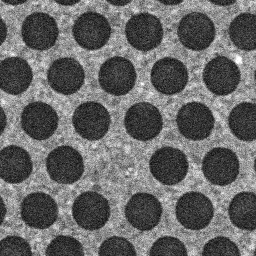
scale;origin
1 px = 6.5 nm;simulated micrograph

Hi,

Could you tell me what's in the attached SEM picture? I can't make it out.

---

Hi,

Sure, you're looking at a regular array of holes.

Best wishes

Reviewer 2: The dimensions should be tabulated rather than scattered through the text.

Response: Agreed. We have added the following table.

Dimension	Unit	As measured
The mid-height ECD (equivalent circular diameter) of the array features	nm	259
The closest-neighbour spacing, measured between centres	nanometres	335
